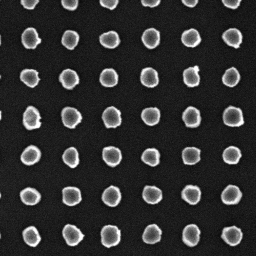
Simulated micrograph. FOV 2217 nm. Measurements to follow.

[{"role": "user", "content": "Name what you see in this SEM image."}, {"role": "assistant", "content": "a regular array of raised bodies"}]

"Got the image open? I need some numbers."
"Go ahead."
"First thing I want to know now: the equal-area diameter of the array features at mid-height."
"160 nm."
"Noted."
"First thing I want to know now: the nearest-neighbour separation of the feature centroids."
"334 nm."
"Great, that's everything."